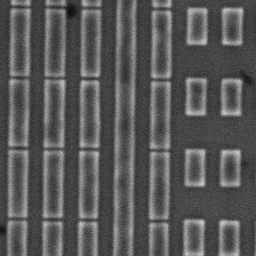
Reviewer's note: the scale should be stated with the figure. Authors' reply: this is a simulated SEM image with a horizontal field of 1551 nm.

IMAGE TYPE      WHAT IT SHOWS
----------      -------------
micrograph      wiring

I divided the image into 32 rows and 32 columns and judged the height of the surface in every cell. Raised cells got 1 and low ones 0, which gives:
00110011001110011001100000000000
00110011000100011001100011001100
01110011001110011001100011001100
01110011001110011001100011001100
01110011001110011001100111001100
01110011001100011001100000000100
01110011001100011001100000000000
01110011001100011001100000000000
01110011001100011001100000000000
00100011000100011001100000000000
01110011001100011001100111001100
01110011001100011001100111001100
01110011001100011001100111001100
01110011001100011001100111001100
01110011001100011001100000000000
01100011001100111001100000000000
01100011001100111001100000000000
01100011001100111001100000000000
00000011001100111001100000000000
01100011001100111001100111001100
01100011001100111001100110001100
01100011001100111001100110001100
01100011001100111001100110001100
01100011001100111001100000000000
01100011001100111001100000000000
01100111001100111001100000000000
01100111001100111001100000000000
01100010001100111001100000000000
01100111001100111001100110001100
01100111001100110001100110001100
01100111001100110001100110001100
01100111001100110001100110001100